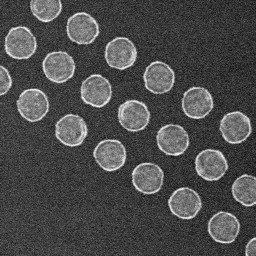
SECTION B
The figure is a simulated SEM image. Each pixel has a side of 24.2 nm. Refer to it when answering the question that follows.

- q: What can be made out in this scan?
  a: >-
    a regular array of raised bodies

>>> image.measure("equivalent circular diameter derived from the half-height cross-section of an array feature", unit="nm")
729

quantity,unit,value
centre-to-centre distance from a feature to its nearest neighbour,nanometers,1080